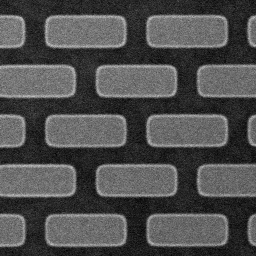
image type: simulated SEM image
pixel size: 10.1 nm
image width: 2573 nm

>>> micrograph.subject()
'groups of lines, slits or small figures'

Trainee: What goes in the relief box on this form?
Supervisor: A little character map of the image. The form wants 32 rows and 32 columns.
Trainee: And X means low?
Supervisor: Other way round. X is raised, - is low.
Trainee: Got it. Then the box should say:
--------------------------------
--------------------------------
XXX---XXXXXXXXX----XXXXXXXXX---X
XXX---XXXXXXXXXX--XXXXXXXXXX---X
XXX---XXXXXXXXXX--XXXXXXXXXX---X
XXX---XXXXXXXXX----XXXXXXXXX---X
--------------------------------
--------------------------------
XXXXXXXXX----XXXXXXXXX---XXXXXXX
XXXXXXXXX---XXXXXXXXXX---XXXXXXX
XXXXXXXXX---XXXXXXXXXX---XXXXXXX
XXXXXXXXX---XXXXXXXXXX---XXXXXXX
--------------------------------
--------------------------------
-----------XXXX----XXXXXXXX-----
XXX---XXXXXXXXXX--XXXXXXXXXX---X
XXX---XXXXXXXXXX--XXXXXXXXXX---X
XXX---XXXXXXXXXX---XXXXXXXXX---X
--------------------------------
--------------------------------
--------------------------------
XXXXXXXXX---XXXXXXXXXX---XXXXXXX
XXXXXXXXX---XXXXXXXXXX---XXXXXXX
XXXXXXXXX---XXXXXXXXXX---XXXXXXX
--------------------------------
--------------------------------
--------------------------------
XXX---XXXXXXXXXX---XXXXXXXXX---X
XXX---XXXXXXXXXX---XXXXXXXXX---X
XXX---XXXXXXXXXX---XXXXXXXXX---X
XXX---XXXXXXXXX----XXXXXXXXX----
--------------------------------